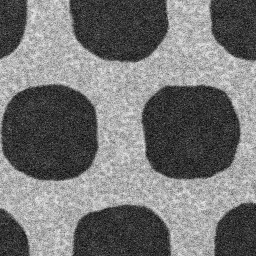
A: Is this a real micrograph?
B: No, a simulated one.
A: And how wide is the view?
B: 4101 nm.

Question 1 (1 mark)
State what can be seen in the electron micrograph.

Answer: holes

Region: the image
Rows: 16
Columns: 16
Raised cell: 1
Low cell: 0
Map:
0011000000111000
0011000000011000
0111100000111000
1111110001111110
1111111111111111
1100111111000011
0000001110000001
0000001110000001
0000001110000001
0000001110000001
1000001111000011
1111111111111111
1111111111111111
0111100000111100
0011100000011000
0011000000011000